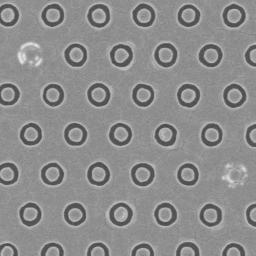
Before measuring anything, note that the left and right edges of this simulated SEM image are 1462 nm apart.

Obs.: a regular array of ring-shaped grooves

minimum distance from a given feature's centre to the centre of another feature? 255 nanometres